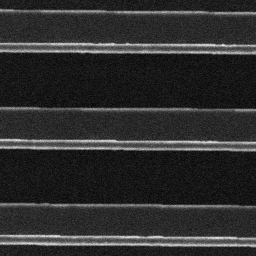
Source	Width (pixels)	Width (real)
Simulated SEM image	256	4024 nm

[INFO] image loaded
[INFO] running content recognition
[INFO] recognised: lines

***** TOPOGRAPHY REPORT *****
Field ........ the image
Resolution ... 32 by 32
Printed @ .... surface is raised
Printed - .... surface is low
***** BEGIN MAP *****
--------------------------------
@@@@@@@@@@@@@@@@@@--------------
@@@@@@@@@@@@@@@@@@@@@@@@@@@@@@@@
@@@@@@@@@@@@@@@@@@@@@@@@@@@@@@@@
@@@@@@@@@@@@@@@@@@@@@@@@@@@@@@@@
@@@@@@@@@@@@@@@@@@@@@@@@@@@@@@@@
--------------------@@@@@@@@@@@@
--------------------------------
--------------------------------
--------------------------------
--------------------------------
--------------------------------
--------------------------------
--------------------------------
@@@@@@@@@@@@@@@@@@@@@@@@@@@@@@@@
@@@@@@@@@@@@@@@@@@@@@@@@@@@@@@@@
@@@@@@@@@@@@@@@@@@@@@@@@@@@@@@@@
@@@@@@@@@@@@@@@@@@@@@@@@@@@@@@@@
-------@@@@@@@@@@@@@@@@@@@@@@@@@
--------------------------------
--------------------------------
--------------------------------
--------------------------------
--------------------------------
--------------------------------
--------------------------------
@@@@@@@@@@@@@@@@@@@@@@@@@@@@@@@@
@@@@@@@@@@@@@@@@@@@@@@@@@@@@@@@@
@@@@@@@@@@@@@@@@@@@@@@@@@@@@@@@@
@@@@@@@@@@@@@@@@@@@@@@@@@@@@@@@@
------------@@@@@@@@@@@@@@@@@@@@
--------------------------------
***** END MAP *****